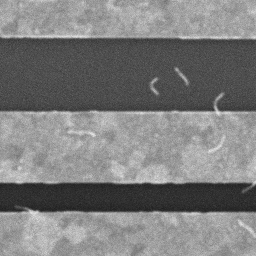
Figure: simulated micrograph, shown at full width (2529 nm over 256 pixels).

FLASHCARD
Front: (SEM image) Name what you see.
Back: lines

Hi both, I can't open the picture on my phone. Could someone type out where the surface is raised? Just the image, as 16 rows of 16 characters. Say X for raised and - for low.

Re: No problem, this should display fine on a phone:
XXXXXXXXXXXXXXXX
XXXXXXXXXXXXXXXX
----------------
----------------
----------------
----------------
----------------
XXXXXXXXXXXXXXXX
XXXXXXXXXXXXXXXX
XXXXXXXXXXXXXXXX
XXXXXXXXXXXXXXXX
----------------
----------------
XXXXXXXXXXXXXXXX
XXXXXXXXXXXXXXXX
XXXXXXXXXXXXXXXX